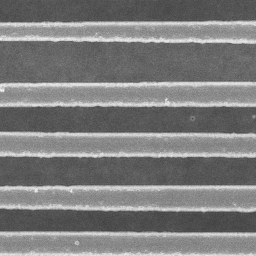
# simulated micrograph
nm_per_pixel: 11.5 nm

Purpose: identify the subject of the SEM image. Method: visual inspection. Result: lines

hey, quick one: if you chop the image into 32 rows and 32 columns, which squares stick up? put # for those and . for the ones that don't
................................
................................
................................
################################
################################
................................
................................
................................
................................
................................
################################
################################
################################
................................
................................
................................
................................
################################
################################
################################
................................
................................
................................
################################
################################
################################
................................
................................
................................
################################
################################
################################